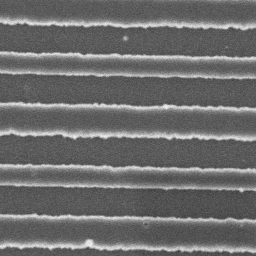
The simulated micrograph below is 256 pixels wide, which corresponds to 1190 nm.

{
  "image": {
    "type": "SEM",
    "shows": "lines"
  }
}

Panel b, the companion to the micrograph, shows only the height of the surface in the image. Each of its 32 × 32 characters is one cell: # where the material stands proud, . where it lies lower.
################################
################################
################################
..............................#.
................................
................................
................................
################################
################################
.................#..############
................................
................................
................................
#############################.#.
################################
################################
################################
................................
................................
................................
................................
################################
################################
....................############
................................
................................
................................
###########################.###.
################################
################################
################################
................................